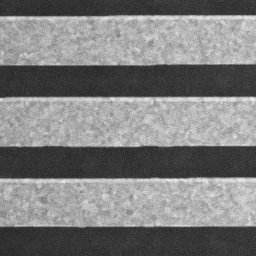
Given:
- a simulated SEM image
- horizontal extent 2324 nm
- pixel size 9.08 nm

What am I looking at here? lines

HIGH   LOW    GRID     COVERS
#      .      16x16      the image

................
################
################
################
................
................
################
################
################
................
................
################
################
################
................
................